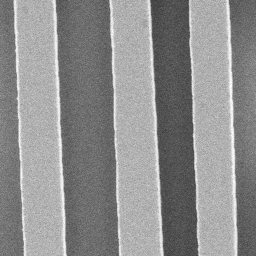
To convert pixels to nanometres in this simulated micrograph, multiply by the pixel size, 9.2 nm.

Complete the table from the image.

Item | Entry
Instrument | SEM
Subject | lines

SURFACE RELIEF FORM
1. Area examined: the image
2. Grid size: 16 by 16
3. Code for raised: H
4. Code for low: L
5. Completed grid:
LHHHLLLHHLLLHHLL
LHHHLLLHHLLLHHLL
LHHHLLLHHLLLHHLL
LHHHLLLHHHLLHHLL
LHHHLLLHHHLLHHLL
LHHHLLLHHHLLHHLL
LHHHLLLHHHLLHHHL
LHHHLLLHHHLLHHHL
LHHHLLLHHHLLHHHL
LHHHLLLHHHLLHHHL
LHHHLLLHHHLLHHHL
LHHHLLLHHHLLHHHL
LHHHLLLHHHLLHHHL
LHHHLLLHHHLLHHHL
LHHHLLLHHHLLHHHL
LLHHLLLHHHLLHHHL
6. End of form